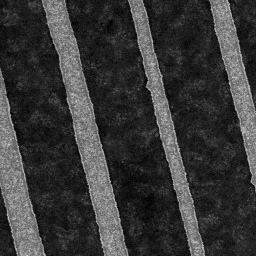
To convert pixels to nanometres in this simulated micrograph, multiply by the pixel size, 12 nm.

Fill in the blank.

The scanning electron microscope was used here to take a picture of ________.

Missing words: one or a few lines or trenches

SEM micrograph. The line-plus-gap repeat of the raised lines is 0.955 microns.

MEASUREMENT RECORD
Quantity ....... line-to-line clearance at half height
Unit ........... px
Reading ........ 61.6